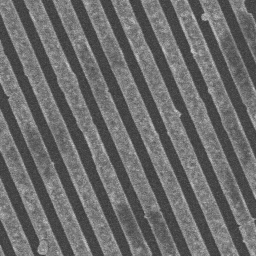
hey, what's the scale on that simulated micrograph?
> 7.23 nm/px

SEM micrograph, parallel lines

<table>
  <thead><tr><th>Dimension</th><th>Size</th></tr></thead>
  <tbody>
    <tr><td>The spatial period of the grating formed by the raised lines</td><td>194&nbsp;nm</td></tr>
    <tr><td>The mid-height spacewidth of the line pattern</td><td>79.7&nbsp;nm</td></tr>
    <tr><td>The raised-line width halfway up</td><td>116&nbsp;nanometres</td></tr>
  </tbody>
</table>